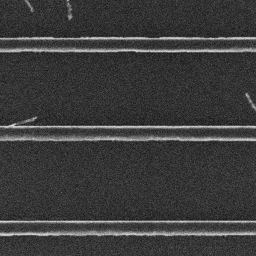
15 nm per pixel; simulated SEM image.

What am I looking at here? lines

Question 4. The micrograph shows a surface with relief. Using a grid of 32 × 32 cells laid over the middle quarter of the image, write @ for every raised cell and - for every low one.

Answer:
--------------------------------
--------------------------------
--------------------------------
--------------------------------
--------------------------------
--------------------------------
--------------------------------
--------------------------------
--------------------------------
--------------------------------
--------------------------------
--------------------------------
--------------------------------
--------------------------------
--------------------------------
--------------------------------
@@@@@@@@@@@@@@@@@@@@@@@@@@@@@@@@
@@@@@@@@@@@@@@@@@@@@@@@@@@@@@@@@
@@@@@@@@@@@@@@@@@@@@@@@@@@@@@@@@
--------------------------------
--------------------------------
--------------------------------
--------------------------------
--------------------------------
--------------------------------
--------------------------------
--------------------------------
--------------------------------
--------------------------------
--------------------------------
--------------------------------
--------------------------------